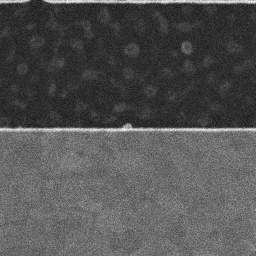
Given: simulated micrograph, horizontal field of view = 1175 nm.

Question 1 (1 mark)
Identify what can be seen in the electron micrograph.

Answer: one or a few lines or trenches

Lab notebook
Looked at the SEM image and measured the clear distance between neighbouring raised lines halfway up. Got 127 pixels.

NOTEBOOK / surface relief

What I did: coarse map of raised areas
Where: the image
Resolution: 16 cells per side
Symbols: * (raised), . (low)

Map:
................
................
................
................
................
................
................
................
****************
****************
****************
****************
****************
****************
****************
****************